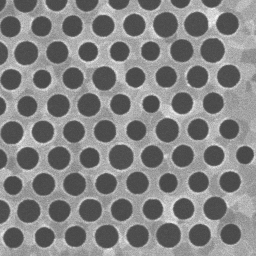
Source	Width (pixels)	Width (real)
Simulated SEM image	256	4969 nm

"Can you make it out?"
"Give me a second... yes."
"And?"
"a regular array of holes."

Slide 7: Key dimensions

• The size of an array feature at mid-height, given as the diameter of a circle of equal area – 435 nm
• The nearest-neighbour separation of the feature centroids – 586 nm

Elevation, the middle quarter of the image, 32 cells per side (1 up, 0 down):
11111111111111111111111110111111
00001111000011110001111000011110
00000110000001100000111000001110
00000110000001100000111000001100
00000110000001100000111000001110
10001111000001111001111100011111
11111111100011111111111111111111
11111000111110011111111111110001
01110000011100001111000011100000
01100000011100000111000011100000
00100000011000000111000011100000
01110000011100001111000011100000
01110000111110011111111111110011
11111111111111111111111110111111
10001111100011110000111100001110
00000111000001110000111000000110
00000110000001100000011000000110
00000110000001110000111000000110
00000111000001110000111000001111
10011111100111111111111110011111
11111111111110001111100111111001
01111000111100000111000011110000
00110000011000000010000001100000
00110000011000000010000001100000
01110000011000000111000001100000
01111000111100000111000011110001
11111111111111111111111111111111
10001111110111111000111110011111
00000111000001110000011100001110
00000111000001100000011100001110
00000011000001110000011100001110
00000111000001110000011100001111